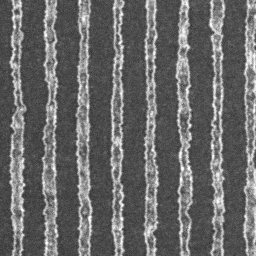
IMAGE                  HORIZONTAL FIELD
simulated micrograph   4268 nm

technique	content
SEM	parallel lines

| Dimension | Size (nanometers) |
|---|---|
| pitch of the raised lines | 556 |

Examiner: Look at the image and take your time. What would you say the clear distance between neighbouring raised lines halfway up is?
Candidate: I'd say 410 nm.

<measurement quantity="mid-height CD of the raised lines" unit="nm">138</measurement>